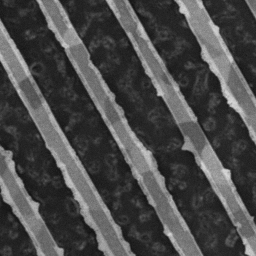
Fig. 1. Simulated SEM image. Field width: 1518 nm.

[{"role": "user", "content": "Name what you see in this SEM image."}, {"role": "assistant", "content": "one or a few lines or trenches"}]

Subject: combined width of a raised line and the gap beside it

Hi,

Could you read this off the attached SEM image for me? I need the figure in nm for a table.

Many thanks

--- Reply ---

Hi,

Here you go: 363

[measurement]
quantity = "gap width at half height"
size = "240 nm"